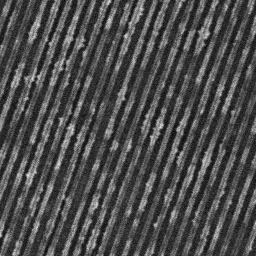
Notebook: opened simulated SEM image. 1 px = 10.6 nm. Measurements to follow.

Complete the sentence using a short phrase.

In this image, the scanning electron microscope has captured parallel lines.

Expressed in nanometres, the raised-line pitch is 122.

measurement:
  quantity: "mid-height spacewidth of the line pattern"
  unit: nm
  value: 76.1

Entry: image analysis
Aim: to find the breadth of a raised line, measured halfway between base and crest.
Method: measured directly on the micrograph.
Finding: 47.5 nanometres